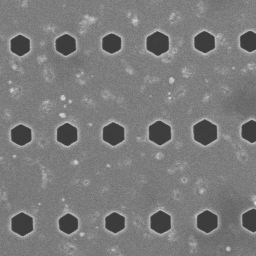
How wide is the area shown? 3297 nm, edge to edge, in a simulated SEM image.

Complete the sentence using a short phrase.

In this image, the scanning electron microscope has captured a regular array of holes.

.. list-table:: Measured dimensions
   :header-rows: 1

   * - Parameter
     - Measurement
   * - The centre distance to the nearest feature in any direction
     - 590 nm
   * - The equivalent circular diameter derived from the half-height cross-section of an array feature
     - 278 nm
